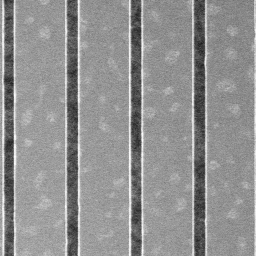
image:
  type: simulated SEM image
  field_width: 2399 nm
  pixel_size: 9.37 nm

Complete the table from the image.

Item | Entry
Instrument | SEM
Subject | one or a few lines or trenches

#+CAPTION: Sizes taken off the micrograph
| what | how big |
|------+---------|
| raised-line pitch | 0.596 micrometres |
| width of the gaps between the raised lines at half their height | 474 nanometres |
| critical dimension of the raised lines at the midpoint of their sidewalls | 122 nanometers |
